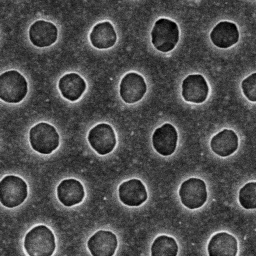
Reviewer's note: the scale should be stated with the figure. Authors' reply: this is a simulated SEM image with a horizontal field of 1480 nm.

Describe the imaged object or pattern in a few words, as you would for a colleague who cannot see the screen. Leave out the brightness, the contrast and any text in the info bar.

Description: a regular array of holes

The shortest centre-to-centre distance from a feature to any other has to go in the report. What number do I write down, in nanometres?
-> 343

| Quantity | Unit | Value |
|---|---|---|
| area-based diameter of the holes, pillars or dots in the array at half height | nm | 166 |